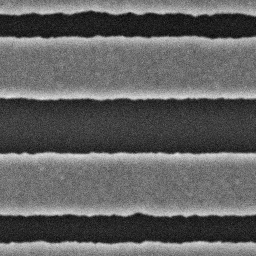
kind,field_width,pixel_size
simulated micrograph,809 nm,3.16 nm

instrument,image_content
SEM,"lines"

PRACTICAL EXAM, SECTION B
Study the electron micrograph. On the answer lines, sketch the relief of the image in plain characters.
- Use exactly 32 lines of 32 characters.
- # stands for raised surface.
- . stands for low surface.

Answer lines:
################################
##########...###################
................................
................................
................................
################################
################################
################################
################################
################################
################################
################################
............#...................
................................
................................
................................
................................
................................
................................
################################
################################
################################
################################
################################
################################
################################
################################
................................
................................
................................
#############.##################
################################